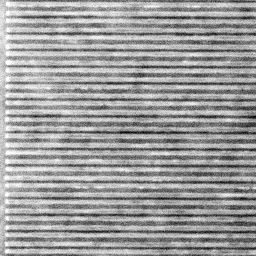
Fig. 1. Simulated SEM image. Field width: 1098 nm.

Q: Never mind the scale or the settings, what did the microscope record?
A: parallel lines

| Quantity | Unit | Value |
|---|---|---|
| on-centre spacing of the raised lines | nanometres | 35.3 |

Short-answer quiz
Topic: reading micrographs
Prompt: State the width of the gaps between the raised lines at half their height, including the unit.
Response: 23.6 nm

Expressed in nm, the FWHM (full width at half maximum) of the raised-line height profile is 12.3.